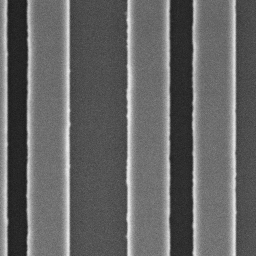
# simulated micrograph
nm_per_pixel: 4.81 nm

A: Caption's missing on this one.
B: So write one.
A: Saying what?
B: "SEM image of lines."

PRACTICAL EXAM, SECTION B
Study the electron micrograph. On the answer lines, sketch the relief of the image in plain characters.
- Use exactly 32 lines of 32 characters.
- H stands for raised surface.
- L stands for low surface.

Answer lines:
HLLHHHHHHLLLLLLLHHHHHLLLHHHHHLLL
HLLHHHHHHLLLLLLLHHHHHLLLHHHHHLLL
HLLHHHHHHLLLLLLLHHHHHLLLHHHHHLLL
HLLHHHHHHLLLLLLLHHHHHLLLHHHHHLLL
HLLHHHHHHLLLLLLLHHHHHLLLHHHHHLLL
HLLLHHHHHLLLLLLLHHHHHLLLHHHHHLLL
HLLLHHHHHLLLLLLLHHHHHLLLHHHHHLLL
HLLLHHHHHLLLLLLLHHHHHLLLHHHHHLLL
HLLHHHHHHLLLLLLLHHHHHLLLHHHHHLLL
HLLHHHHHHLLLLLLLHHHHHLLLHHHHHLLL
HLLHHHHHHLLLLLLLHHHHHLLLHHHHHLLL
HLLHHHHHHLLLLLLLHHHHHLLLHHHHHLLL
HLLHHHHHHLLLLLLLHHHHHLLLHHHHHLLL
HLLHHHHHHLLLLLLLHHHHHLLLHHHHHLLL
HLLHHHHHHLLLLLLLHHHHHLLLHHHHHLLL
HLLHHHHHHLLLLLLLHHHHHLLLHHHHHLLL
HLLHHHHHHLLLLLLLHHHHHLLLHHHHHLLL
HLLHHHHHHLLLLLLLHHHHHLLLHHHHHLLL
HLLHHHHHHLLLLLLLHHHHHLLLHHHHHLLL
HLLHHHHHHLLLLLLLHHHHHLLLHHHHHLLL
HLLHHHHHHLLLLLLLHHHHHLLLHHHHHLLL
HLLHHHHHHLLLLLLLHHHHHLLLHHHHHLLL
HLLHHHHHHLLLLLLLHHHHHLLLHHHHHLLL
HLLHHHHHHLLLLLLLHHHHHLLLHHHHHLLL
HLLHHHHHHLLLLLLLHHHHHLLLHHHHHLLL
HLLHHHHHHLLLLLLLHHHHHLLLHHHHHLLL
HLLHHHHHHLLLLLLLHHHHHLLLHHHHHLLL
HLLHHHHHHLLLLLLLHHHHHLLLHHHHHLLL
HLLLHHHHHLLLLLLLHHHHHLLLHHHHHLLL
HLLHHHHHHLLLLLLLHHHHHLLLHHHHHLLL
HLLHHHHHHLLLLLLLHHHHHLLLHHHHHLLL
HLLHHHHHHLLLLLLLHHHHHLLLHHHHHLLL